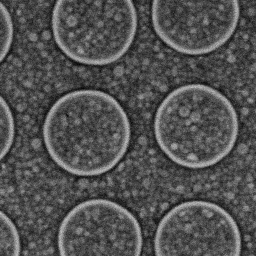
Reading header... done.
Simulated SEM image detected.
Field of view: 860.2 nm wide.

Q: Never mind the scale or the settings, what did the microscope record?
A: raised bodies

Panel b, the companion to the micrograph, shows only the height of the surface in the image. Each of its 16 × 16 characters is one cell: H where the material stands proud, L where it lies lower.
LLLLHHHHLLHHHHHL
HLLHHHHHLLHHHHHL
HLLLHHHHLLHHHHLL
LLLLLHHLLLLLLLLL
LLLLLLLLLLLLLLLL
LLLLLLLLLLLLHLLL
LLLLHHHLLLHHHHLL
HLLHHHHHLLHHHHHL
HLLHHHHHLLHHHHHL
LLLHHHHHLLHHHHLL
LLLLHHHLLLLLLLLL
LLLLLLLLLLLLLLLL
LLLLLLLLLLLLLLLL
LLLLHHHHLLLHHHLL
HLLLHHHHHLHHHHHL
HLLLHHHHHLHHHHHL